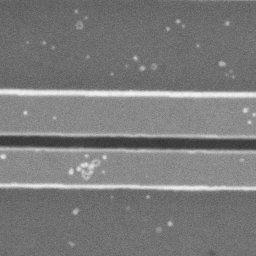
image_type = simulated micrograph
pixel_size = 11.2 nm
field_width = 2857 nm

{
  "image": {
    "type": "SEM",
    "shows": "lines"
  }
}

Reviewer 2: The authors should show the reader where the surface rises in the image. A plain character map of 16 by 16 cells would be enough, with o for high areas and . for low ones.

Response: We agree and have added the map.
................
................
................
................
................
................
oooooooooooooooo
oooooooooooooooo
oooooooooooooooo
oooooooooooooooo
oooooooooooooooo
oooooooooooooooo
................
................
................
................